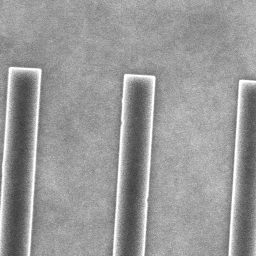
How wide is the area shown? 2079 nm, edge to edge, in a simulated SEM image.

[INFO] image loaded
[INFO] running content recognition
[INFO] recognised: one or a few lines or trenches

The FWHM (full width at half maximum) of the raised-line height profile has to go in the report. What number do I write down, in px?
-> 30.6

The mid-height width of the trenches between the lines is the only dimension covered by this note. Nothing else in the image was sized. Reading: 686 nm